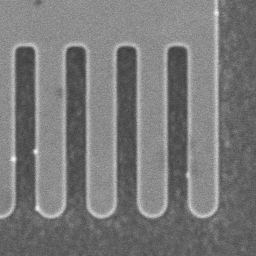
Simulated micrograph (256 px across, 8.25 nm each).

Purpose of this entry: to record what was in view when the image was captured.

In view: groups of lines, slits or small figures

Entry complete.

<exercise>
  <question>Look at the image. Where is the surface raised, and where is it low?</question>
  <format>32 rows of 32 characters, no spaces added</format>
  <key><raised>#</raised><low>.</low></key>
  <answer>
###########################.....
###########################.....
###########################.....
###########################.....
###########################.....
###########################.....
##..####...####..####..####.....
##..####...###...####...###.....
##..####...###...####...###.....
##..####...###...####...###.....
##..####...###...####...###.....
##..####...###...####...###.....
##..####...###...####...###.....
##..####...###...####...###.....
##..####...####..####...###.....
##..####...####..####...###.....
##..####...####..####...###.....
##..####...####..####...###.....
##..####...####..####...###.....
##..####...####..####...###.....
##..####...####..####...###.....
##..####...####..####..####.....
##..####...####..####..####.....
##..####...####..####...###.....
##..####...####..####...###.....
##..####...####..####...###.....
#....###...###....##....###.....
................................
................................
................................
................................
................................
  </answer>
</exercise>